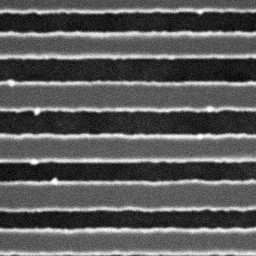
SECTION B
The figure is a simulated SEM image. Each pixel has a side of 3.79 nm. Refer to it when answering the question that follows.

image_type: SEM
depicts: lines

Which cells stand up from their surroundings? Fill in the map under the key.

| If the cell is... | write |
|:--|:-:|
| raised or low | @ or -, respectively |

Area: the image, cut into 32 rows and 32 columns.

@@@@@@@@@@@@@@@@@@@@@@@@@@@@@@@@
@@@@-@@-@-@@@-@-----------------
--------------------------------
--------------------------------
@@@@@@@@@@@@@@@@@@@@@@@@@@@@@@@@
@@@@@@@@@@@@@@@@@@@@@@@@@@@@@@@@
@@@@@@@@@@@@@@@@@@@@@@@@@@@@@@@@
--------------------------------
--------------------------------
--------------------------------
@@@@@@@@@@@@@@@@@@@@@@@@@@@@@@@@
@@@@@@@@@@@@@@@@@@@@@@@@@@@@@@@@
@@@@@@@@@@@@@@@@@@@@@@@@@@@@@@@@
@@@@@@@@@@@@@@@@@@@@@@@@@@@@@@@@
--------------------------------
--------------------------------
--------------------------------
@@@@@@@@@@@@@@@@@@@@@@@@@@@@@@@@
@@@@@@@@@@@@@@@@@@@@@@@@@@@@@@@@
@@@@@@@@@@@@@@@@@@@@@@@@@@@@@@@@
--------------------------------
--------------------------------
--------------------------------
@@@@@@@@@@@@@@@@@@@@@@@@@@@@@@@@
@@@@@@@@@@@@@@@@@@@@@@@@@@@@@@@@
@@@@@@@@@@@@@@@@@@@@@@@@@@@@@@@@
--------------------------------
--------------------------------
--------------------------------
@@@@@@@@@@@@@@@@@@@@@@@@@@@@@@@@
@@@@@@@@@@@@@@@@@@@@@@@@@@@@@@@@
@@@@@@@@@@@@@@@@@@@@@@@@@@@@@@@@